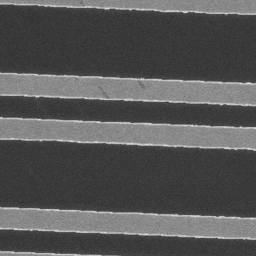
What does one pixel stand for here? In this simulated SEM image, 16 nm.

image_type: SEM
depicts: lines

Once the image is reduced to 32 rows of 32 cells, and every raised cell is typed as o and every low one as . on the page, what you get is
.ooooooooooooooooooooooooooooooo
......................oooooooooo
................................
................................
................................
................................
................................
................................
................................
ooooooo.........................
oooooooooooooooooooooooooooooooo
oooooooooooooooooooooooooooooooo
...............ooooooooooooooooo
................................
................................
ooooooooooooooooooo.............
oooooooooooooooooooooooooooooooo
.....o.ooooooooooooooooooooooooo
............................oooo
................................
................................
................................
................................
................................
................................
................................
oooooooooooo....................
oooooooooooooooooooooooooooooooo
oooooooooooooooooooooooooooooooo
......................oooooooooo
................................
................................